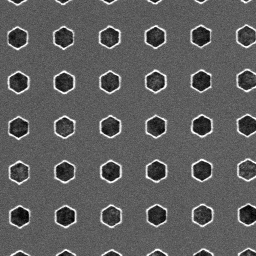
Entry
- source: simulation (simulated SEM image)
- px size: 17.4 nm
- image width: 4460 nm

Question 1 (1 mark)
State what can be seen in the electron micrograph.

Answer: a regular array of holes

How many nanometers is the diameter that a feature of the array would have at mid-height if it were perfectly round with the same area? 344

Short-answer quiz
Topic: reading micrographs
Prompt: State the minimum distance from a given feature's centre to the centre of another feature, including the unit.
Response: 777 nm